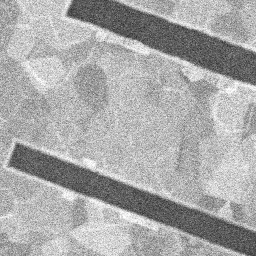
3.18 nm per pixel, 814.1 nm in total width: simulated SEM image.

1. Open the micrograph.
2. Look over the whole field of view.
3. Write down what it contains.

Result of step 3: one or a few lines or trenches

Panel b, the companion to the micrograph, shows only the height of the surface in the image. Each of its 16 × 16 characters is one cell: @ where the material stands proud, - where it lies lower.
@@@@-----@@@@@@@
@@@@@------@@@@@
@@@@@@@@------@@
@@@@@@@@@@------
@@@@@@@@@@@@@---
@@@@@@@@@@@@@@@@
@@@@@@@@@@@@@@@@
@@@@@@@@@@@@@@@@
@@@@@@@@@@@@@@@@
@--@@@@@@@@@@@@@
@-----@@@@@@@@@@
@@@-----@@@@@@@@
@@@@@@-----@@@@@
@@@@@@@@@-----@@
@@@@@@@@@@@-----
@@@@@@@@@@@@@@--